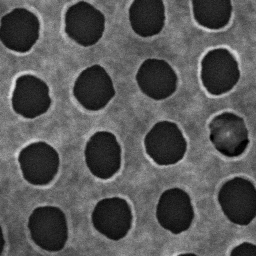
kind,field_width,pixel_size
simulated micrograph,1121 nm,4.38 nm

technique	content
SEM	a regular array of holes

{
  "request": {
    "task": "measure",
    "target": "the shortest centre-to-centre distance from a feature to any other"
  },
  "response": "279 nm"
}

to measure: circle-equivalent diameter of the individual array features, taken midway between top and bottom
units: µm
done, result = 0.185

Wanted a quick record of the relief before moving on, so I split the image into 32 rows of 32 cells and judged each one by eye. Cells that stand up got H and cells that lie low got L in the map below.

HHHHHHHHHLLHHHHHLLLLHHHHLLLLLHHH
HLLLHHHHLLLLLHHHLLLLLHHHLLLLLHHH
LLLLLHHHLLLLLHHHLLLLLHHHLLLLLHHH
LLLLLHHHLLLLLHHHLLLLHHHHHHLLHHHH
LLLLLHHHLLLLLHHHHLLHHHHHHHHHHHHH
LLLLHHHHHHLLHHHHHHHHHHHHHHHHHHHH
HHLHHHHHHHHHHHHHHHHHHHHHHHLLLHHH
HHHHHHHHHHHHHHHHHHLLHHHHHLLLLLHH
HHHHHHHHHHHLLHHHHLLLLLHHHLLLLLHH
HHHLHHHHHHLLLLHHHLLLLLHHHLLLLLHH
HHLLLLHHHLLLLLHHHLLLLLHHHLLLLLHH
HHLLLLHHHLLLLLHHHHLLLLHHHHLLHHHH
HLLLLLHHHHLLLLHHHHHLHHHHHHHHHHHH
HHLLLLHHHHHLLHHHHHHHHHHHHHHHHHHH
HHHLLHHHHHHHHHHHHHHHHHHHHHHLLLHH
HHHHHHHHHHHHHHHHHHHLLLHHHHLLLLLH
HHHHHHHHHHHHLLHHHHHLLLLHHHLLHLLH
HHHHHHHHHHHLLLLHHHLLLLLHHHLLLLLH
HHHLLLLHHHHLLLLHHHLLLLLHHHHLLLLH
HHLLLLLHHHHLLLLHHHHLLLLHHHHHLLHH
HHLLLLLHHHHLLLLHHHHHLLHHHHHHHHHH
HHHLLLLHHHHLLLLHHHHHHHHHHHHHHHHH
HHHLLLLHHHHHHHHHHHHHHHHHHHHHHLLH
HHHHHHHHHHHHHHHHHHHHHHHHHHHHLLLL
HHHHHHHHHHHHHHHHHHHHLLLLHHHLLLLL
HHHHHHHHHHHHLLLLHHHHLLLLHHHLLLLL
HHHHLLLLHHHHLLLLHHHHLLLLHHHHLLLL
HHHHLLLLHHHLLLLLLHHHLLLLHHHHHLLL
HHHHLLLLHHHHLLLLHHHHLLLLHHHHHHHH
HHHHLLLLLHHHHLLLHHHHHHHHHHHHHHHH
LHHHLLLLHHHHHHHHHHHHHHHHHHHHHHLL
HHHHHHLHHHHHHHHHHHHHHHHHHHHHHLLL